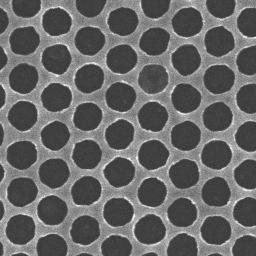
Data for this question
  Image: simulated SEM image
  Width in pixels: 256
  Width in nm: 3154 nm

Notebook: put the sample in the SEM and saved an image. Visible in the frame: a regular array of holes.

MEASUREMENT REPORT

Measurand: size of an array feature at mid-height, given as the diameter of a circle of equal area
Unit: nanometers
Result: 371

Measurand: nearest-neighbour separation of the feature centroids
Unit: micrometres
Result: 0.455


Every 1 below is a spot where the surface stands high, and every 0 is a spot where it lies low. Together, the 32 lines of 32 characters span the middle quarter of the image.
01111000011000000011000001100000
01100000001100000110000001110000
11100000001111011110000000111000
11100000001111111110000000111111
11100000001111111110000000111111
11100000011100000110000000110000
00110000011000000011000001100000
00111111110000000011110111100000
00111111110000000011111111100000
00111111110000000011100111100000
01100000111000000111000001100000
11100000011100001110000000110000
11000000001111111100000000111111
11000000011111111100000000111111
11000000011110001110000000111100
01100000011000000110000001110000
01110001110000000011000011100000
00111111110000000011111111100000
01111111110000000111111111100000
01110000111000000111000011100000
11100000011000001110000001100000
11000000011110111110000000111000
11000000001111111100000000111111
11000000011110011100000000111111
11100000011100000110000000110000
01100000110000000111000001100000
01111111110000000011101111000000
00111111110000000011111111000000
01110000110000000111100111000000
11100000011000000111000001100000
11000000011100011110000001110000
11000000001111111100000000111111